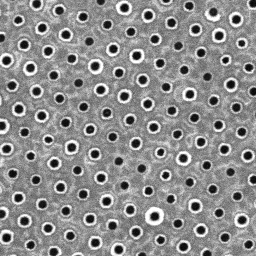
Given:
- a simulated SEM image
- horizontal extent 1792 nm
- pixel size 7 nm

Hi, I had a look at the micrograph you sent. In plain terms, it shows a regular array of holes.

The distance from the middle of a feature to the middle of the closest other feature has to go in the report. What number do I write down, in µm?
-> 0.167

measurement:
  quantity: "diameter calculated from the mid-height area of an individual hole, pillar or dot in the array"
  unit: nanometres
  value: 62.2